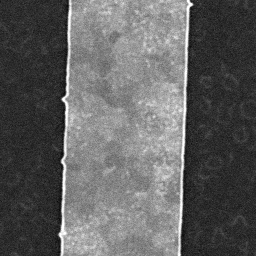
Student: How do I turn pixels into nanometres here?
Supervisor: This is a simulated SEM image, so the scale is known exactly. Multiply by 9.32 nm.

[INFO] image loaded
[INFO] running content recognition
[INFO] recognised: one or a few lines or trenches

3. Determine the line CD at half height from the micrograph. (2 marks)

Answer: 1100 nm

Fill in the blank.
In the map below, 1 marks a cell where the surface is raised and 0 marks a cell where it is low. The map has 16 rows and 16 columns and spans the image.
0000111111110000
0000111111110000
0000111111110000
0000111111110000
0000111111110000
0000111111110000
0000111111110000
0000111111110000
0000111111100000
0000111111100000
0000111111100000
0000111111100000
0000111111100000
0000111111100000
0000111111100000
0000111111100000